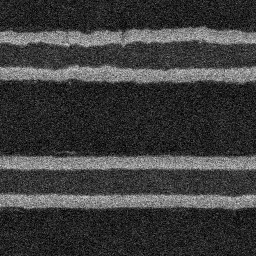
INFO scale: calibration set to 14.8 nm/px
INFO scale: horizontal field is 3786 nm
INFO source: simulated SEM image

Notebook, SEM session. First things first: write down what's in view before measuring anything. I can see one or a few lines or trenches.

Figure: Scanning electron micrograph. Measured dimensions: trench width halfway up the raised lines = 1260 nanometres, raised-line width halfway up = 610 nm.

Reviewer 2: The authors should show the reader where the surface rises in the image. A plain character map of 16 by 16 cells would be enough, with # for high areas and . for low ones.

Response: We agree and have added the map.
................
................
################
################
################
................
................
................
................
................
################
################
################
................
................
................